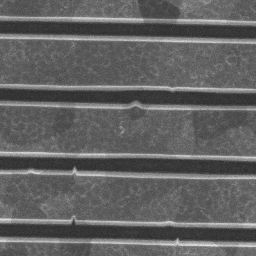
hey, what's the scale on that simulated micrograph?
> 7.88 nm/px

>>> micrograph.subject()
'one or a few lines or trenches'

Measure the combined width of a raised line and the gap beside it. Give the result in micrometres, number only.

0.533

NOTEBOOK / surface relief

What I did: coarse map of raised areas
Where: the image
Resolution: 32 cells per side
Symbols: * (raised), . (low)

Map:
********************************
********************************
..............******************
................................
................................
********************************
********************************
********************************
********************************
********************************
********************************
................................
................................
*************************.......
********************************
********************************
********************************
********************************
********************************
....................************
................................
.*.**....*......................
********************************
********************************
********************************
********************************
********************************
********************************
................................
................................
****************************....
********************************